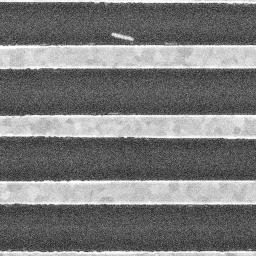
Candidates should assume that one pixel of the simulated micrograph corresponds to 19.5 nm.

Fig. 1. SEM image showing lines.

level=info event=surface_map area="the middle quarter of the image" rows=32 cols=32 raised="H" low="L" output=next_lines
HHHHHHHHHHHHHHHHHHHHHHHHHHHHHHHH
LLLLLLLLLLLLLLLLLLLLLLLLLLLLLLLL
LLLLLLLLLLLLLLLLLLLLLLLLLLLLLLLL
LLLLLLLLLLLLLLLLLLLLLLLLLLLLLLLL
LLLLLLLLLLLLLLLLLLLLLLLLLLLLLLLL
LLLLLLLLLLLLLLLLLLLLLLLLLLLLLLLL
LLLLLLLLLLLLLLLLLLLLLLLLLLLLLLLL
LLLLLLLLLLLLLLLLLLLLLLLLLLLLLLLL
LLLLLLLLLLLLLLLLLLLLLLLLLLLLLLLL
LLLLLLLLLLLLLLLLLLLLLLLLLLLLLLLL
LLLLLLLLLLLLLLLLLLLLLLLLLLLLLLLL
LLLLLLLLLLLLLLLLLLLLLLLLLLLLLLLL
LLLLLLLLLLLLLLLLLLLLLLLLLLLLLLLL
HHHHHHHHHHHHHHHHHHHHHHHHHHHHHHHH
HHHHHHHHHHHHHHHHHHHHHHHHHHHHHHHH
HHHHHHHHHHHHHHHHHHHHHHHHHHHHHHHH
HHHHHHHHHHHHHHHHHHHHHHHHHHHHHHHH
HHHHHHHHHHHHHHHHHHHHHHHHHHHHHHHH
LLLLLLLLLLLLLLLLLLLLLLLLLLLLLLLL
LLLLLLLLLLLLLLLLLLLLLLLLLLLLLLLL
LLLLLLLLLLLLLLLLLLLLLLLLLLLLLLLL
LLLLLLLLLLLLLLLLLLLLLLLLLLLLLLLL
LLLLLLLLLLLLLLLLLLLLLLLLLLLLLLLL
LLLLLLLLLLLLLLLLLLLLLLLLLLLLLLLL
LLLLLLLLLLLLLLLLLLLLLLLLLLLLLLLL
LLLLLLLLLLLLLLLLLLLLLLLLLLLLLLLL
LLLLLLLLLLLLLLLLLLLLLLLLLLLLLLLL
LLLLLLLLLLLLLLLLLLLLLLLLLLLLLLLL
LLLLLLLLLLLLLLLLLLLLLLLLLLLLLLLL
LLLLLLLLLLLLLLLLLLLLHLHHLLLLLLHH
HHHHHHHHHHHHHHHHHHHHHHHHHHHHHHHH
HHHHHHHHHHHHHHHHHHHHHHHHHHHHHHHH